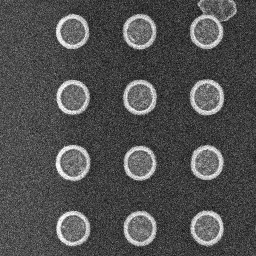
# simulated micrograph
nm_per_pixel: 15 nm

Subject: a regular array of raised bodies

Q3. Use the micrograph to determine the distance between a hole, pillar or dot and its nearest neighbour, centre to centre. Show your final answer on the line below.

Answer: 982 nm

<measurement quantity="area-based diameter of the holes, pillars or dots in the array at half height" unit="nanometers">461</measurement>